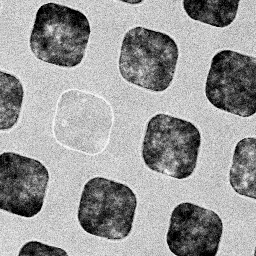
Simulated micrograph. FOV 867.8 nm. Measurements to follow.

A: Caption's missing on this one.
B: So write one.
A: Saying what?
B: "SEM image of holes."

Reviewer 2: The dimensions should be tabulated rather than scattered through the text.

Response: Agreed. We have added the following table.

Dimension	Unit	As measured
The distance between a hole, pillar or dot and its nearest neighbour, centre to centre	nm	305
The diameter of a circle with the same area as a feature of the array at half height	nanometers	211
